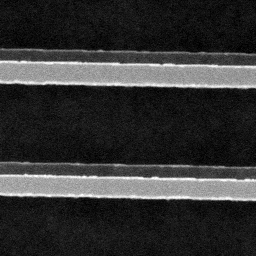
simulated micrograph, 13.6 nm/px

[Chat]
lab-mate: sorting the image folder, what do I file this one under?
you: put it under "lines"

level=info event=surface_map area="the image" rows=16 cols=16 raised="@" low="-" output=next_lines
----------------
----------------
----------------
@@@@@@@@@@@@@@@@
@@@@@@@@@@@@@@@@
----------------
----------------
----------------
----------------
----------------
@@@@@@@@@@@@@@@@
@@@@@@@@@@@@@@@@
--------------@@
----------------
----------------
----------------